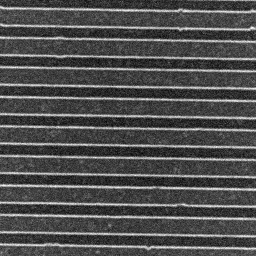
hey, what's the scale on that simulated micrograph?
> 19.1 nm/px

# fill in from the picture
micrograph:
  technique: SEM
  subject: parallel lines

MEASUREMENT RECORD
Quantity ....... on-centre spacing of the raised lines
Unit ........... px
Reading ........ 29.5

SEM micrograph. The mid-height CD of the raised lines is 0.327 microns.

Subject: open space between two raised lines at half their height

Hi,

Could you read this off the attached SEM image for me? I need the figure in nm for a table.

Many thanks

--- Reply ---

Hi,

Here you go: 239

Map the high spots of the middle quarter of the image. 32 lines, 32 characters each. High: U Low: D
DDDDDDDDDDDDDDDDDDDDDDDDDDDDDDDD
UUUUUUUUUUUUUUUUUUUUUUDDDDDDDDDD
UUUUUUUUUUUUUUUUUUUUUUUUUUUUUUUU
UUUUUUUUUUUUUUUUUUUUUUUUUUUUUUUU
UUUUUUUUUUUUUUUUUUUUUUUUUUUUUUUU
DDDDDDUUUUUUUUUUUUUUUUUUUUUUUUUU
DDDDDDDDDDDDDDDDDDDDDDDDDDDDDDDD
DDDDDDDDDDDDDDDDDDDDDDDDDDDDDDDD
DDDDDDDDDDDDDDDDDDDDDDDDDDDDDDDD
UUUUUUUUUUUUUUUUUUUUUUUUUUUUUUUU
UUUUUUUUUUUUUUUUUUUUUUUUUUUUUUUU
UUUUUUUUUUUUUUUUUUUUUUUUUUUUUUUU
UUUUUUUUUUUUUUUUUUUUUUUUUUUUUUUU
DDDDDDDDDDDDDDDDDDDDDDDDDDDDDDDD
DDDDDDDDDDDDDDDDDDDDDDDDDDDDDDDD
DDDDDDDDDDDDDDDDDDDDDDDDDDDDDDDD
UUUUUUUUUUUUUUUUUUUUUUUUUUUUUUUU
UUUUUUUUUUUUUUUUUUUUUUUUUUUUUUUU
UUUUUUUUUUUUUUUUUUUUUUUUUUUUUUUU
UUUUUUUUUUUUUUUUUUUUUUUUUUUUUUUU
DDDDDDDDDDDDDDDDDDDDDDDDDDDDDDDU
DDDDDDDDDDDDDDDDDDDDDDDDDDDDDDDD
DDDDDDDDDDDDDDDDDDDDDDDDDDDDDDDD
UUUUUUUUDDDDDDDDDDDDDDDDDDDDDDDD
UUUUUUUUUUUUUUUUUUUUUUUUUUUUUUUU
UUUUUUUUUUUUUUUUUUUUUUUUUUUUUUUU
UUUUUUUUUUUUUUUUUUUUUUUUUUUUUUUU
DDDDDDUUUUUUUUUUUUUUUUUUUUUUUUUU
DDDDDDDDDDDDDDDDDDDDDDDDDDDDDDDD
DDDDDDDDDDDDDDDDDDDDDDDDDDDDDDDD
DDDDDDDDDDDDDDDDDDDDDDDDDDDDDDDD
UUUUUUUUUUUUUUUUUUUUUUUUUUUUUUUU